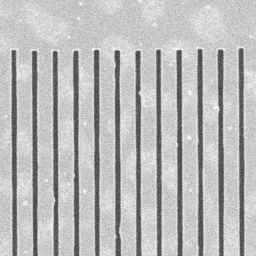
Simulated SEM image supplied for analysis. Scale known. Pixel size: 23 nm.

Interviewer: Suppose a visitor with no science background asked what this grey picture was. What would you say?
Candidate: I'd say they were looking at parallel lines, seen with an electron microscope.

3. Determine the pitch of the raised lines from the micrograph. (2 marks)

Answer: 475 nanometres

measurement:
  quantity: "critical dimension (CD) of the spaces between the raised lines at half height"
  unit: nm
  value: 121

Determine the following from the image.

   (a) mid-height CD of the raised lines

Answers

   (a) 339 nm